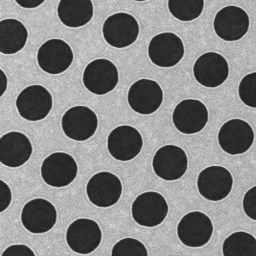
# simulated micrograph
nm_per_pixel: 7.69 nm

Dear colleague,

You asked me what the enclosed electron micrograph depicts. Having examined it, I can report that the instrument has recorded a regular array of holes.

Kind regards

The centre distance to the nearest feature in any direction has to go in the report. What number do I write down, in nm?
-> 379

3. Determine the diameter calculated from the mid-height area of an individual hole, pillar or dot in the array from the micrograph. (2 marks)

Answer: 0.271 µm